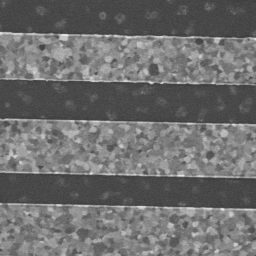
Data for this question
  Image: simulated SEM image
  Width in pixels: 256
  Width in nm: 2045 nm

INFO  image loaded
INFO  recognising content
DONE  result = one or a few lines or trenches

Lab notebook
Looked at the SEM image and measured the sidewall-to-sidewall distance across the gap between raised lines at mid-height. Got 284 nanometers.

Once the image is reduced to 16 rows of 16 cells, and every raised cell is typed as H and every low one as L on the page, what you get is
LLLLLLLLLLLLLLLL
LLLLLLLLLLLLLLLL
HHHHHHHHHHHHHHHH
HHHHHHHHHHHHHHHH
HHHHHHHHHHHHHHHH
LLLLLLLLLLLLLLLL
LLLLLLLLLLLLLLLL
HHLLLLLLLLLLLLLL
HHHHHHHHHHHHHHHH
HHHHHHHHHHHHHHHH
HHHHHHHHHHHHHHHH
LLLLLLLLLLLLLLLL
LLLLLLLLLLLLLLLL
HHHHHHHHHHHHHHHH
HHHHHHHHHHHHHHHH
HHHHHHHHHHHHHHHH